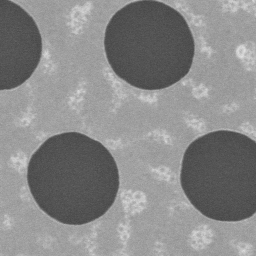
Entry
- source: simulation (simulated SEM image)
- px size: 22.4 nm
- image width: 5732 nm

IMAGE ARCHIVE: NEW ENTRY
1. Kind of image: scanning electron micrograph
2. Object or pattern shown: holes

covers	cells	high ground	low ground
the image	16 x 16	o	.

.ooooooo...ooooo
..ooooo.....oooo
...oooo.....oooo
...oooo.....oooo
..ooooo.....oooo
.oooooooo.oooooo
oooooooooooooooo
oooooooooooooooo
ooo..oooooooo..o
oo.....ooooo....
oo.....oooo.....
oo.....oooo.....
oo.....ooooo....
ooo...ooooooo...
oooooooooooooooo
oooooooooooooooo